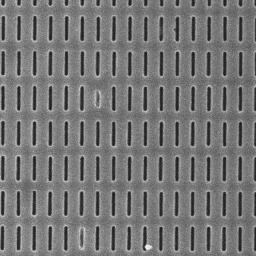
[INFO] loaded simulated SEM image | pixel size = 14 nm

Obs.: a regular array of holes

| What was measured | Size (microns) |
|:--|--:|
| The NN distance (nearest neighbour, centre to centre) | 0.22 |